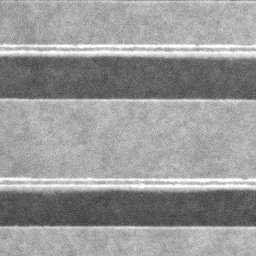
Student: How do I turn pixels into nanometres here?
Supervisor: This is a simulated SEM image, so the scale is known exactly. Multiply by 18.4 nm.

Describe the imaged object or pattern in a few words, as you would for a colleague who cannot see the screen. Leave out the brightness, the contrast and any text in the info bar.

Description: lines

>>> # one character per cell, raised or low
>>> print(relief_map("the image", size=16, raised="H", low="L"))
HHHHHHHHHHHHHHHH
HHHHHHHHHHHHHHHH
HHHHHHHHHHHHHHHH
LLLLLLLLLLLLLLLL
LLLLLLLLLLLLLLLL
LLLLLLLLLLLLLLLL
HHHHHHHHHHHHHHHH
HHHHHHHHHHHHHHHH
HHHHHHHHHHHHHHHH
HHHHHHHHHHHHHHHH
HHHHHHHHHHHHHHHH
HHHHHHHHHHHHHHHH
LLLLLLLLLLLLLLLL
LLLLLLLLLLLLLLLL
HHHHHHHHHHHHHHHH
HHHHHHHHHHHHHHHH